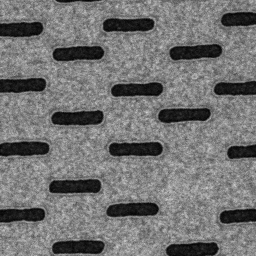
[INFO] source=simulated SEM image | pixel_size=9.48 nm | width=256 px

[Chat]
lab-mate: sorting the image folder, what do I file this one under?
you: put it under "a regular array of holes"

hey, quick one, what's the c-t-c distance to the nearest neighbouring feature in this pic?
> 563 nm